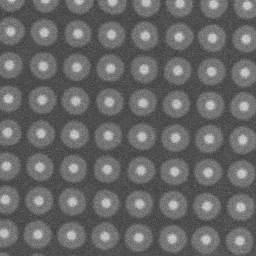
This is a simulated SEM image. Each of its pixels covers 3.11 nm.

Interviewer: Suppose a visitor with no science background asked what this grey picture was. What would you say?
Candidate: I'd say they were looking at an array of small figures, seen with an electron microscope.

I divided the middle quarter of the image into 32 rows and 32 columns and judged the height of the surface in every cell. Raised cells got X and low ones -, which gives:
XXXXXX--XXXXXXX--XXXXXX--XXXXXXX
XXXXXX--XXXXXXX--XXXXXX--XXXXXXX
XXXXXX---XXXXX---XXXXXX--XXXXXXX
-XXXX----XXXXX----XXXX---XXXXXX-
-------------------XX------XXX--
--------------------------------
-XXXX-----XXX------XX-----------
XXXXXX---XXXXX---XXXXX----XXXX--
XXXXXX--XXXXXXX--XXXXXX--XXXXXX-
XXXXXX--XXXXXXX-XXXXXXX--XXXXXX-
XXXXXX--XXXXXXX--XXXXXX--XXXXXX-
XXXXX----XXXXX---XXXXX---XXXXXX-
--XX------XXX-----XXX-----XXXX--
--------------------------------
--XX----------------------------
XXXXX----XXXX-----XXX------XX---
XXXXXX--XXXXXX---XXXXX---XXXXXX-
XXXXXX--XXXXXX--XXXXXXX--XXXXXX-
XXXXXX--XXXXXX--XXXXXXX-XXXXXXX-
XXXXXX--XXXXXX--XXXXXXX-XXXXXXX-
-XXXX----XXXX----XXXXX---XXXXXX-
--------------------------XXXX--
--------------------------------
XXXX-----XXX------XXX-----------
XXXXX---XXXXXX---XXXXX---XXXXX--
XXXXXX--XXXXXX--XXXXXX---XXXXXX-
XXXXX---XXXXXX--XXXXXXX-XXXXXXX-
XXXXX---XXXXXX--XXXXXXX-XXXXXXX-
XXXXX---XXXXX---XXXXXX---XXXXXX-
----------XX------XXX----XXXXX--
--------------------------------
XXXX----------------------------